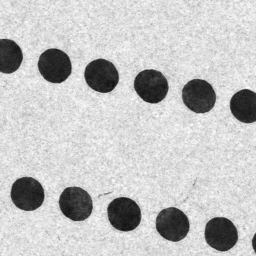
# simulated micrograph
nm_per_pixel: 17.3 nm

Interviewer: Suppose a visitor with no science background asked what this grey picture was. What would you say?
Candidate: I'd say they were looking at a regular array of holes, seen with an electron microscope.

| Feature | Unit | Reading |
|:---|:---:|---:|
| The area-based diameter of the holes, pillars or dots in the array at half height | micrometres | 0.607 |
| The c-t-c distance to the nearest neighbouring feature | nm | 851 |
